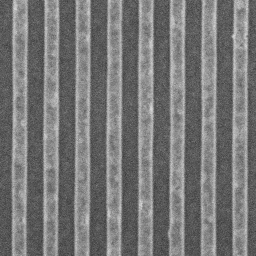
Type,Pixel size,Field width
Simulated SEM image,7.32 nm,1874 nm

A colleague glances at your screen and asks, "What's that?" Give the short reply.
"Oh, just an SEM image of parallel lines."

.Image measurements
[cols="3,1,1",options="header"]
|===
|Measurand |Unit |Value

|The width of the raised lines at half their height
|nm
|97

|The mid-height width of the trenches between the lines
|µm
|0.132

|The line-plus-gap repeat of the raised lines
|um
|0.231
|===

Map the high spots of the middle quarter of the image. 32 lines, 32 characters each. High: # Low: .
...###.....###.....###.....###..
...###.....###.....###.....###..
...###.....###.....###.....###..
...###.....###.....###.....###..
...###.....###.....###.....###..
...###.....###.....###.....###..
...###.....###.....###.....###..
...###.....###.....###.....###..
...###.....###.....###.....###..
...###.....###.....###.....###..
...###.....###.....###.....###..
...###.....###.....###.....###..
...###.....###.....###.....###..
...###.....###.....###.....###..
...###.....###.....###.....###..
...###.....###.....###.....###..
...###.....###.....###.....###..
...###.....###.....###.....###..
...###.....###.....###.....###..
...###.....###.....###.....###..
...###.....###.....###.....###..
...###.....###.....###.....###..
...###.....###.....###.....###..
...###.....###.....###.....###..
...###.....###.....###.....###..
...###.....###.....###.....###..
...###.....###.....###.....###..
...###.....###.....###.....###..
...###.....###.....###.....###..
...###.....###.....###.....###..
...###.....###.....###.....###..
...###.....###.....###.....###..